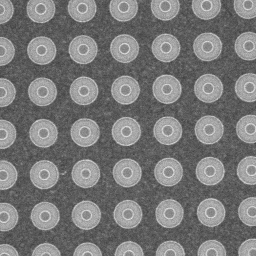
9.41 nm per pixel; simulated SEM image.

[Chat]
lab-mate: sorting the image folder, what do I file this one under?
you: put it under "an array of small figures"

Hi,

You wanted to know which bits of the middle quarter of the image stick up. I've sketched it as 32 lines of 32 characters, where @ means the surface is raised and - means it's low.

@@@@@@@@@@@@@@@@@@@@@@@@@@@@@@@@
@@@@@@@@@@@@@@@@@@@@@@@@@@@@@@@@
@@@@@@@@@@@@@@@@@@@@@@@@@@@@@@@@
@@@@--@@@@@@@@---@@@@@@-----@@@@
@@------@@@@@-----@@@@@------@@@
@@------@@@@---@---@@@---@@--@@@
@@--@@--@@@@--@@@--@@@---@@--@@@
@@--@@--@@@@--@@---@@@@------@@@
@@------@@@@@-----@@@@@-----@@@@
@@@----@@@@@@@---@@@@@@@@--@@@@@
@@@@@@@@@@@@@@@@@@@@@@@@@@@@@@@@
@@@@@@@@@@@@@@@@@@@@@@@@@@@@@@@@
@@@@@@@@@@@@@@@@@@@@@@@@@@@@@@@@
@@@@@@@@@@@@@@@-@@@@@@@@@--@@@@@
@@@----@@@@@@-----@@@@@-----@@@@
@@------@@@@-------@@@@--@@--@@@
@@--@@---@@@---@@--@@@@--@@--@@@
@@--@@---@@@---@@--@@@@--@@--@@@
@@------@@@@-------@@@@------@@@
@@@-----@@@@@-----@@@@@@----@@@@
@@@@@-@@@@@@@@@@@@@@@@@@@@@@@@@@
@@@@@@@@@@@@@@@@@@@@@@@@@@@@@@@@
@@@@@@@@@@@@@@@@@@@@@@@@@@@@@@@@
@@@@@@@@@@@@@@@@@@@@@@@@@@@@@@@@
@@@@---@@@@@@@----@@@@@@----@@@@
@@@-----@@@@@------@@@@------@@@
@@---@---@@@---@@--@@@@--@@--@@@
@@---@---@@@---@@--@@@@--@@--@@@
@@-------@@@@------@@@@------@@@
@@@-----@@@@@-----@@@@@@----@@@@
@@@@---@@@@@@@@--@@@@@@@@@@@@@@@
@@@@@@@@@@@@@@@@@@@@@@@@@@@@@@@@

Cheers